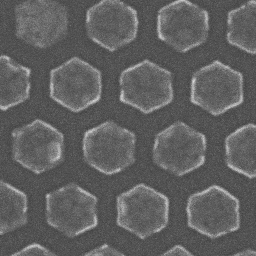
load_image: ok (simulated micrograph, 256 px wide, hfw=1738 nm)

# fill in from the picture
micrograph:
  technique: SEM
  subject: a regular array of raised bodies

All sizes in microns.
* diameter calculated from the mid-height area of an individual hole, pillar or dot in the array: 0.338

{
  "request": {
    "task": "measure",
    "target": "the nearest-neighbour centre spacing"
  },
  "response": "480 nm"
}